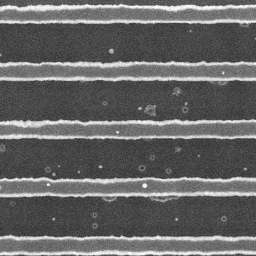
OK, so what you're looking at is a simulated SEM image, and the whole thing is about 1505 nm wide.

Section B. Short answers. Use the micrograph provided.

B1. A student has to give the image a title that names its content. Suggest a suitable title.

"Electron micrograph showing lines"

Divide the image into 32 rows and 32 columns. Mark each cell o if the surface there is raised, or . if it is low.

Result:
................................
oooooooooooooooooooooooooooooooo
oooooooooooooooooooooooooooooooo
................................
................................
................................
................................
................................
oooooooooooooooooooooooooooooooo
oooooooooooooooooooooooooooooooo
................................
................................
................................
................................
................................
oooooooooooooooooooooooooooooooo
oooooooooooooooooooooooooooooooo
................................
................................
................................
................................
................................
oooooooooooooooooooooooooooooooo
oooooooooooooooooooooooooooooooo
ooo.....oo......................
................................
................................
................................
................................
................................
oooooooooooooooooooooooooooooooo
oooooooooooooooooooooooooooooooo